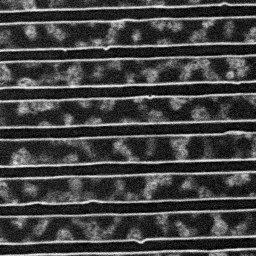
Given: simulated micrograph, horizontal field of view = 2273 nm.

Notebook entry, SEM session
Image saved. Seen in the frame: parallel lines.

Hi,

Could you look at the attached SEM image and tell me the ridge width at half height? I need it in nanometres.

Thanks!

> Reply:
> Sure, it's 240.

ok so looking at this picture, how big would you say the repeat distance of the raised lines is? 343 nm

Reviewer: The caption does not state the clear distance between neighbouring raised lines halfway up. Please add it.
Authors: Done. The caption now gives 98.7 nm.